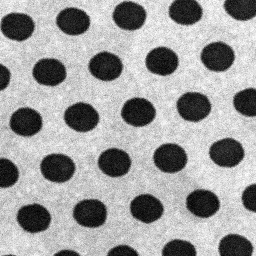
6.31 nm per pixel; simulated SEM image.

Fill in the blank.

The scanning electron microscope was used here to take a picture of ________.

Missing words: a regular array of holes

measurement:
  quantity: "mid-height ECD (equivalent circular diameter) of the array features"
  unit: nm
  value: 209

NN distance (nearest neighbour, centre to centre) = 351 nm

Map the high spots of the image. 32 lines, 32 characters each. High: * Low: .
***************..****....***....
**.****....***....***....***....
....***....***....***....****..*
....***....****...**************
*...*****.**********************
**************************...***
************..*****...***....***
*****..****....***....***....***
.***....***....***....****...***
.***....***....*****.***********
.****...************************
***********************..*****..
****************...***....***...
**..****....***....***....***...
*....***....***.....**....****..
*....***....****...*************
**...*****.*********************
***************************...**
**************.*****...***....**
******...***....***....***.....*
..***....***....***....****...**
..***....****...****..**********
..****...***********************
.******************************.
*****************..****....***..
****.*****...***....***.....**..
**....***....***.....***...****.
**....***....****...************
***...*****.********************
****************************..**
*********************...***.....
*******...***....***.....**.....